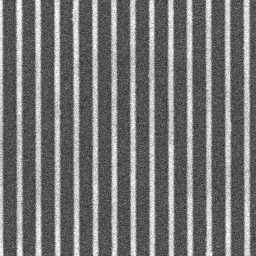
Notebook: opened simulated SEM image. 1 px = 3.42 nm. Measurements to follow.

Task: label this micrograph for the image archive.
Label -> parallel lines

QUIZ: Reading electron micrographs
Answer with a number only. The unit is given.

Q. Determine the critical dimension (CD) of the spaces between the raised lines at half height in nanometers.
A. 51.7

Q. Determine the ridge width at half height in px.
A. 3.74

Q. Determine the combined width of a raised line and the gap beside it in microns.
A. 0.0648